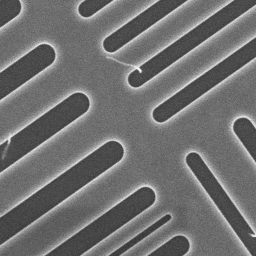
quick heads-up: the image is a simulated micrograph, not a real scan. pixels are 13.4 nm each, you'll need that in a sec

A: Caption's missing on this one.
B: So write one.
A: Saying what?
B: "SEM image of groups of lines, slits or small figures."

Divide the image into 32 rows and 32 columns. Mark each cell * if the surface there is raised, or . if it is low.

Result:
...*******....*****....******...
..********..******...******....*
.***************....******...***
***************....*****....****
**************...******...******
*****.*******...*****....******.
****...*************....*****...
**.....************...******....
*.....***********....*****....**
....************...******....***
...*************..******...*****
..********************....******
********...**********...********
*******....********....*********
*****.....*********...**********
****.....********************...
**.....**********************...
*.....************************..
....********...****************.
...********....********..******.
..*******.....*********...******
********.....***********..******
*******.....*************..*****
*****.....*******..******...****
****.....*******...*******...***
**.....********....********..***
*.....*******.....**********..**
.....*******....****.*******...*
...*******.....***..*********..*
..*******.....***.****.*******..
********....****.***....******..
******.....***..***....********.